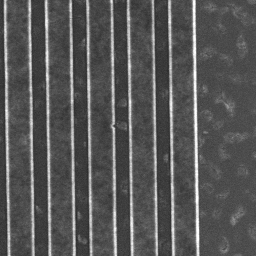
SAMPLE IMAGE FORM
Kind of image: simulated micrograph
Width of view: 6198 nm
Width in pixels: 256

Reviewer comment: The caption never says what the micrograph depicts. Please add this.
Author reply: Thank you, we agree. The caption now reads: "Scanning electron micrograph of parallel lines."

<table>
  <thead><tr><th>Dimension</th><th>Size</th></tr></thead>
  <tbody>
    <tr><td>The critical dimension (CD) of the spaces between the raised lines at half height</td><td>393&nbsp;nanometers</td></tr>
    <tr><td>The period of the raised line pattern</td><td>0.995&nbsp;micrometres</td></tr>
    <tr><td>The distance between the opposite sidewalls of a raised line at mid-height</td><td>0.59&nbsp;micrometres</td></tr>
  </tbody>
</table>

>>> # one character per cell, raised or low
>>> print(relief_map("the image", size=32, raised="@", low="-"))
-@@@--@@@--@@@--@@@--@@@--------
-@@@--@@@--@@@--@@@--@@@--------
-@@@--@@@--@@@--@@@--@@@--------
-@@@--@@@--@@@--@@@--@@@--------
-@@@--@@@--@@@--@@@--@@@--------
-@@@--@@@--@@@--@@@--@@@--------
-@@@--@@@--@@@--@@@--@@@--------
-@@@--@@@--@@@--@@@--@@@--------
-@@@--@@@--@@@--@@@--@@@--------
-@@@--@@@--@@@--@@@--@@@--------
-@@@--@@@--@@@--@@@--@@@--------
-@@@--@@@--@@@--@@@--@@@--------
-@@@--@@@--@@@--@@@--@@@--------
-@@@--@@@--@@@--@@@--@@@--------
-@@@--@@@--@@@--@@@--@@@--------
-@@@--@@@--@@@--@@@--@@@--------
-@@@--@@@--@@@--@@@---@@--------
-@@@--@@@--@@@--@@@---@@--------
-@@@--@@@--@@@--@@@---@@--------
-@@@--@@@--@@@--@@@---@@--------
-@@@--@@@--@@@--@@@--@@@--------
-@@@--@@@--@@@--@@@--@@@@-------
-@@@--@@@--@@@--@@@--@@@@-------
-@@@--@@@--@@@--@@@--@@@@-------
-@@@--@@@--@@@--@@@---@@@-------
-@@@--@@@--@@@--@@@@--@@@-------
-@@@--@@@--@@@--@@@@--@@@-------
-@@@--@@@--@@@--@@@@--@@@-------
-@@@--@@@--@@@---@@@--@@@-------
-@@@--@@@--@@@---@@@--@@@-------
-@@@--@@@--@@@---@@@--@@@-------
-@@@--@@@--@@@---@@@--@@@-------